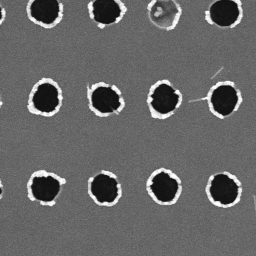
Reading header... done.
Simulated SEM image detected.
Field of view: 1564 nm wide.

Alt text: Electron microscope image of a regular array of holes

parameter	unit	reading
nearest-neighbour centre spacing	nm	364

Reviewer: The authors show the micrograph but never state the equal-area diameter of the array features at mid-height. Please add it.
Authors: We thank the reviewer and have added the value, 169 nanometres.